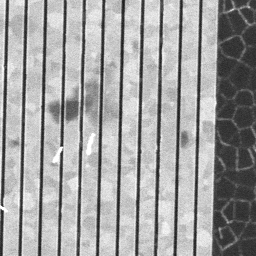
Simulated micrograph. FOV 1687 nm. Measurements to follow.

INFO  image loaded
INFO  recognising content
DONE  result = parallel lines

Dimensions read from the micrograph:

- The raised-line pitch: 128 nanometers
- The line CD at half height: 98.8 nm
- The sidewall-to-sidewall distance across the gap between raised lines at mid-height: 24.7 nm